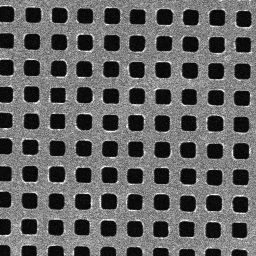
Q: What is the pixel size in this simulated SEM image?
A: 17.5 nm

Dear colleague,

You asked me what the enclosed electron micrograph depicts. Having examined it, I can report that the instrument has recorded a regular array of holes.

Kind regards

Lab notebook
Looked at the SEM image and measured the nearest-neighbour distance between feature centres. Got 0.455 µm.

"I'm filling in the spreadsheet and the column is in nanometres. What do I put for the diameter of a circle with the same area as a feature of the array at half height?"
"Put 306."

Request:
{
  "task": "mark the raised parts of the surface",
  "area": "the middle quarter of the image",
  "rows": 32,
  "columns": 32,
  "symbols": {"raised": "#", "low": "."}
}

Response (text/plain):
.##....###....##....###....###..
.##....###....##....###....##...
.##....###....##....###....##...
###########..####..#####..####..
################################
################################
###....###....###...###....###..
.##....###....##....###....##...
.##....###....##....###....##...
###....###....##....###....##...
################################
################################
####..##########################
###....###....##....###...###...
###....##.....##....###....##...
###....###....##....###....##...
####..####...###....###...####..
################################
################################
###....###...###....###...####..
###....##.....##....##.....##...
.##....##.....##....##.....##...
###....###...###....###....##...
##################.#####..#####.
################################
################################
###....##....###....###...###...
###....##.....##....##....###...
###....##.....##....##....###...
###...####...###....###...###...
################################
################################